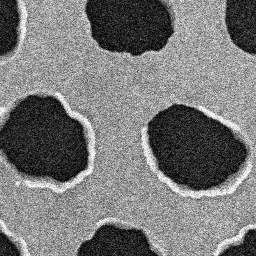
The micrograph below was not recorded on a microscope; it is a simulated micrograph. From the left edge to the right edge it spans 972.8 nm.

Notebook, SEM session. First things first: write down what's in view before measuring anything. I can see holes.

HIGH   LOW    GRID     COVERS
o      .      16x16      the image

.oooo......ooo..
.ooooo.....ooo..
.ooooo.....ooo..
oooooooooooooooo
oooooooooooooooo
oooooooooooooooo
o...oooooooooooo
.....oooo.....oo
.....oooo......o
.....ooooo......
o....ooooo.....o
ooooooooooo...oo
oooooooooooooooo
oooooooooooooooo
oooooo...ooooooo
.oooo.....oooo..